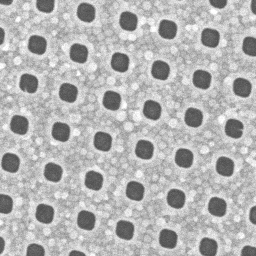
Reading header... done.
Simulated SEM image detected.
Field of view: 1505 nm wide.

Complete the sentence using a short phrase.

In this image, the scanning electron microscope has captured a regular array of holes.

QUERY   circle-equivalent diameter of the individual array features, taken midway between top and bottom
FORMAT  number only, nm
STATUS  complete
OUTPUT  118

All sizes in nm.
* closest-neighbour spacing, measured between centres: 235